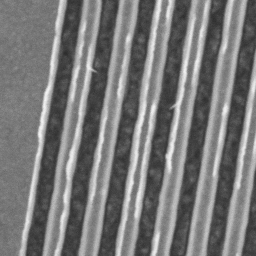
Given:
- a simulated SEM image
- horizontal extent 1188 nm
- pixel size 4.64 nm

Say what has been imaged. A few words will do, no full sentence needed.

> parallel lines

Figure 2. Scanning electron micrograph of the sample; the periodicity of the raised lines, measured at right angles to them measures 165 nm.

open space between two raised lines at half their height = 89.2 nm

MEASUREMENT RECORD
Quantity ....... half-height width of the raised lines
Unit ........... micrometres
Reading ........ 0.0732